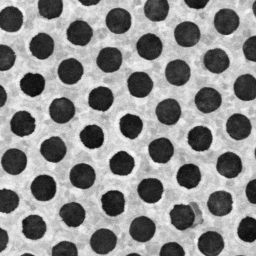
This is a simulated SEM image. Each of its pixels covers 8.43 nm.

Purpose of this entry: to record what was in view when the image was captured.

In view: a regular array of holes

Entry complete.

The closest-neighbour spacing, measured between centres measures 330 nanometres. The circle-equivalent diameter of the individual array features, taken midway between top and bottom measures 0.225 um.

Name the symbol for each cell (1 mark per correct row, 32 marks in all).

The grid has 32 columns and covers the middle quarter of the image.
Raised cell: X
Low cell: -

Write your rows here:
-----XXX------XXXXXXXXXXX------X
-----XXXX-----XXXXXXXXXXX-------
-----XXXXXXXXXXXX----XXXX-------
----XXXXXXXXXXXX------XXX-------
---XXXXXXXXXXXXX------XXXX-----X
XXXXXXXXXXXXXXXX------XXXXXX-XXX
XXXXXXX-----XXXX------XXXXXXXXXX
XXXXXX------XXXXX----XXXXXXXXXXX
-XXXXX-------XXXXX--XXXXXXXXXXXX
--XXXX------XXXXXXXXXXXX-----XXX
---XXX------XXXXXXXXXXX------XXX
---XXXXX---XXXXXXXXXXXX------XXX
---XXXXXXXXXXXXX-XXXXXX------XXX
--XXXXXXXXXXXX-----XXXX------XXX
-XXXXXXXXXXXXX------XXXX----XXXX
XXXXXX---XXXXX------XXXXXXXXXXXX
XXXXX-----XXXX-----XXXXXXXXXXXXX
XXXX------XXXXX----XXXXXXXXXXXX-
XXXX------XXXXXX--XXXXXX--XXXXX-
XXXX------XXXXXXXXXXXX-----XXXX-
-XXXX----XXXXXXXXXXXX------XXXXX
-XXXXXXXXXXXXXXXXXXXX-------XXXX
-XXXXXXXXXXXX---XXXXX------XXXXX
XXXXXXXXXXXX-----XXXXX-----XXXXX
XXXXXXXXXXX-------XXXX----XXXXXX
XX-----XXXX-------XXXXXXXXXXX---
XX------XXXX-----XXXXXXXXXXXX---
X-------XXXX----XXXXXXXXXXXX----
X-------XXXXXXXXXXXXX--XXXXX----
XX------XXXXXXXXXXX-----XXXX----
XX-----XXXXXXXXXXX-------XXXX---
XXXXXXXXXXXXXXXXXX-------XXXXXXX